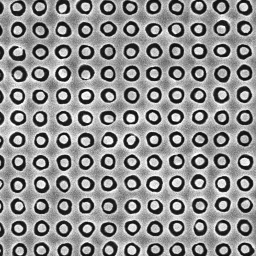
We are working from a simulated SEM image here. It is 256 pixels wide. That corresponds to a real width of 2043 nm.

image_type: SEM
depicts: a regular array of ring-shaped grooves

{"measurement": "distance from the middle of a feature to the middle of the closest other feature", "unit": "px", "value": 21.2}